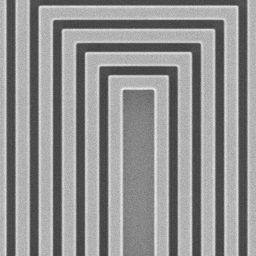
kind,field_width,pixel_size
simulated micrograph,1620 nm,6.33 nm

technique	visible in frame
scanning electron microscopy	groups of lines, slits or small figures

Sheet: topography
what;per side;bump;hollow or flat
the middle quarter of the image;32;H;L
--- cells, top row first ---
HHHLLHHHHLLLLLLLLLLLLLLLLLLLHHHH
HHHLLHHHHLLLLLLLLLLLLLLLLLLLHHHH
HHHLLHHHHLLLLLLLLLLLLLLLLLLLLHHH
HHHLLHHHHLLHHHHHHHHHHHHHHHLLLHHH
HHHLLHHHHLLHHHHHHHHHHHHHHHLLLHHH
HHHLLHHHHLLHHHHHHHHHHHHHHHLLLHHH
HHHLLHHHHLLHHHHLLLLLLLHHHHLLLHHH
HHHLLHHHHLLHHHLLLLLLLLLHHHLLLHHH
HHHLLHHHHLLHHHLLLLLLLLLHHHLLLHHH
HHHLLHHHHLLHHHLLLLLLLLLHHHLLLHHH
HHHLLHHHHLLHHHLLLLLLLLLHHHLLLHHH
HHHLLHHHHLLHHHLLLLLLLLLHHHLLLHHH
HHHLLHHHHLLHHHLLLLLLLLLHHHLLLHHH
HHHLLHHHHLLHHHLLLLLLLLLHHHLLLHHH
HHHLLHHHHLLHHHLLLLLLLLLHHHLLLHHH
HHHLLHHHHLLHHHLLLLLLLLLHHHLLLHHH
HHHLLHHHHLLHHHLLLLLLLLLHHHLLLHHH
HHHLLHHHHLLHHHLLLLLLLLLHHHLLLHHH
HHHLLHHHHLLHHHLLLLLLLLLHHHLLLHHH
HHHLLHHHHLLHHHLLLLLLLLLHHHLLLHHH
HHHLLHHHHLLHHHLLLLLLLLLHHHLLLHHH
HHHLLHHHHLLHHHLLLLLLLLLHHHLLLHHH
HHHLLHHHHLLHHHLLLLLLLLLHHHLLLHHH
HHHLLHHHHLLHHHLLLLLLLLLHHHLLLHHH
HHHLLHHHHLLHHHLLLLLLLLLHHHLLLHHH
HHHLLHHHHLLHHHLLLLLLLLLHHHLLLHHH
HHHLLHHHHLLHHHLLLLLLLLLHHHLLLHHH
HHHLLHHHHLLHHHLLLLLLLLLHHHLLLHHH
HHHLLHHHHLLHHHLLLLLLLLLHHHLLLHHH
HHHLLHHHHLLHHHLLLLLLLLLHHHLLLHHH
HHHLLHHHHLLHHHLLLLLLLLLHHHLLLHHH
HHHLLHHHHLLHHHLLLLLLLLLHHHLLLHHH